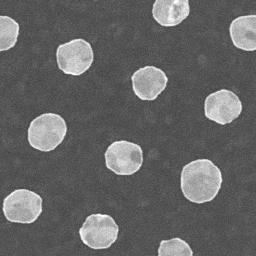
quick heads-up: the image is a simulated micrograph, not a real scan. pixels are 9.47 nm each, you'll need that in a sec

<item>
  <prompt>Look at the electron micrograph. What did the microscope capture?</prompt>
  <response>a regular array of raised bodies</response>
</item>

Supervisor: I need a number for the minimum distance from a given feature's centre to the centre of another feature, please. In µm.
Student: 0.736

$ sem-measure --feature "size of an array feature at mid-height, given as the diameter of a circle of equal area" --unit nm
338